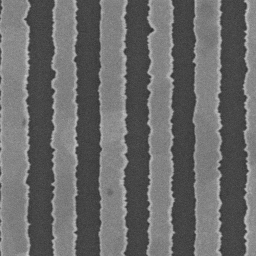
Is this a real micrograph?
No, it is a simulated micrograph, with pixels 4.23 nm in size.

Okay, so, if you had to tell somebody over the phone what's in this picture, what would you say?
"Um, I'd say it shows lines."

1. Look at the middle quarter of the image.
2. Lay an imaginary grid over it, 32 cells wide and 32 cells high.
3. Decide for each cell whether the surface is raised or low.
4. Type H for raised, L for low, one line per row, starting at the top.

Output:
HHHLLLLLLHHHHHHLLLLLLLHHHHHLLLLL
HHHLLLLLLHHHHHHLLLLLLHHHHHHLLLLL
HHHLLLLLLHHHHHHLLLLLLHHHHHHLLLLL
HHHLLLLLLHHHHHHLLLLLLLHHHHHLLLLL
HHHLLLLLLHHHHHHLLLLLLLHHHHHLLLLL
HHHLLLLLLHHHHHHLLLLLLHHHHHHLLLLL
HHHLLLLLLHHHHHHLLLLLLHHHHHHLLLLL
HHHLLLLLLHHHHHHLLLLLLLHHHHHLLLLL
HHHLLLLLLHHHHHHLLLLLLHHHHHHLLLLL
HHHLLLLLLHHHHHHLLLLLLHHHHHHLLLLL
HHHLLLLLLHHHHHHLLLLLLHHHHHHLLLLL
HHHLLLLLLHHHHHHLLLLLLHHHHHHLLLLL
HHHLLLLLLHHHHHHLLLLLLHHHHHHLLLLL
HHHLLLLLLHHHHHHLLLLLLHHHHHHLLLLL
HHHLLLLLLHHHHHHLLLLLLHHHHHHLLLLL
HHHLLLLLLHHHHHHLLLLLLHHHHHHLLLLL
HHHLLLLLLHHHHHHHLLLLLLHHHHHLLLLL
HHHLLLLLLHHHHHHLLLLLLHHHHHHLLLLL
HHHLLLLLLHHHHHHLLLLLLHHHHHHLLLLL
HHHLLLLLLHHHHHHLLLLLLHHHHHHLLLLL
HHHLLLLLLHHHHHHLLLLLLHHHHHHLLLLL
HHHLLLLLLLHHHHHHLLLLLHHHHHHLLLLL
HHHLLLLLLHHHHHHLLLLLLLHHHHHLLLLL
HHHLLLLLLHHHHHHHLLLLLLHHHHHLLLLL
HHHLLLLLLHHHHHHHLLLLLHHHHHHLLLLL
HHHLLLLLLHHHHHHLLLLLLHHHHHHLLLLL
HHHLLLLLLHHHHHHLLLLLLHHHHHHLLLLL
HHHLLLLLLHHHHHHLLLLLLHHHHHHLLLLL
HHHLLLLLLHHHHHHLLLLLLHHHHHHLLLLL
HHHLLLLLLHHHHHHLLLLLLHHHHHHLLLLL
HHHLLLLLLHHHHHHLLLLLLHHHHHHLLLLL
HHHLLLLLLHHHHHHLLLLLLHHHHHHLLLLL